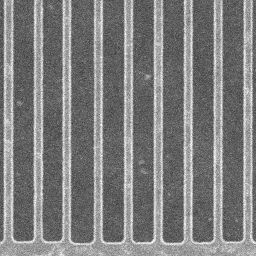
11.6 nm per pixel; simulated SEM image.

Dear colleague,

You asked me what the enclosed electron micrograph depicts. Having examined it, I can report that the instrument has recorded parallel lines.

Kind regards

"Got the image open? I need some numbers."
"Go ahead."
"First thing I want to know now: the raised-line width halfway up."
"0.078 micrometres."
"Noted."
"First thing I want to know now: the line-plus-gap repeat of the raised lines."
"346 nanometres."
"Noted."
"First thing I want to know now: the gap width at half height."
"267 nanometers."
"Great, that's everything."